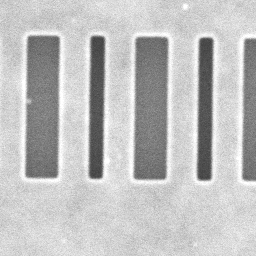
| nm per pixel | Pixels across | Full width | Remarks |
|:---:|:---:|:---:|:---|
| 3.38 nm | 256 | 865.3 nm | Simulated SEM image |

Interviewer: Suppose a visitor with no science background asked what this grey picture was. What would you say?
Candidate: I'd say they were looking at groups of lines, slits or small figures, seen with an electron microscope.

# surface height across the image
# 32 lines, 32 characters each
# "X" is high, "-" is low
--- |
XXXXXXXXXXXXXXXXXXXXXXXXXXXXXXXX
XXXXXXXXXXXXXXXXXXXXXXXXXXXXXXXX
XXXXXXXXXXXXXXXXXXXXXXXXXXXXXXXX
XXXXXXXXXXXXXXXXXXXXXXXXXXXXXXXX
XXXX---XXXXX-XXXXX--XXXXXXXXXXXX
XXX-----XXX--XXXX----XXXX--XXX--
XXX-----XXX--XXXX----XXXX--XXX--
XXX-----XXX--XXXX----XXXX--XXX--
XXX-----XXX--XXXX----XXXX--XXX--
XXX-----XXX--XXXX----XXXX--XXX--
XXX-----XXX--XXXX----XXXX--XXX--
XXX-----XXX--XXXX----XXXX--XXX--
XXX-----XXX--XXXX----XXXX--XXX--
XXX-----XXX--XXXX----XXXX--XXX--
XXX-----XXX--XXXX----XXXX--XXX--
XXX----XXXX--XXXX----XXXX--XXX--
XXX----XXXX--XXXX----XXXX--XXX--
XXX----XXXX--XXXX----XXXX--XXX--
XXX----XXXX--XXXX----XXXX--XXX--
XXX----XXXX--XXXX----XXXX--XXX--
XXX----XXXX--XXXX----XXXX--XXX--
XXX----XXXX--XXXX----XXX---XXX--
XXXXXXXXXXXXXXXXX---XXXXX-XXXX--
XXXXXXXXXXXXXXXXXXXXXXXXXXXXXXXX
XXXXXXXXXXXXXXXXXXXXXXXXXXXXXXXX
XXXXXXXXXXXXXXXXXXXXXXXXXXXXXXXX
XXXXXXXXXXXXXXXXXXXXXXXXXXXXXXXX
XXXXXXXXXXXXXXXXXXXXXXXXXXXXXXXX
XXXXXXXXXXXXXXXXXXXXXXXXXXXXXXXX
XXXXXXXXXXXXXXXXXXXXXXXXXXXXXXXX
XXXXXXXXXXXXXXXXXXXXXXXXXXXXXXXX
XXXXXXXXXXXXXXXXXXXXXXXXXXXXXXXX